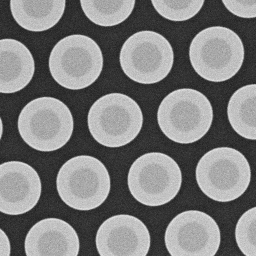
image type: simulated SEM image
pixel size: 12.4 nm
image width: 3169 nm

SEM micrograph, an array of small figures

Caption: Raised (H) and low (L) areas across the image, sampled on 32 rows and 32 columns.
LHHHHHHHLLHHHHHHHLLHHHHHHLLLHHHH
LHHHHHHHLLHHHHHHLLLLHHHHHLLLLHHH
LLHHHHHLLLLHHHHHLLLLLHHLLLLLLLLL
LLLHHHLLLLLLLLLLLLLLLLLLLLHHLLLL
LLLLLLLLLHHLLLLLHHHHLLLLHHHHHHLL
HHHLLLLHHHHHLLLLHHHHHLLLHHHHHHLL
HHHHLLHHHHHHHLLHHHHHHHLLHHHHHHLL
HHHHLLHHHHHHHLLHHHHHHHLLHHHHHHLL
HHHHLLHHHHHHHLLHHHHHHLLLHHHHHHLL
HHHHLLLHHHHHLLLLHHHHHLLLLHHHHLLL
HHHLLLLHHHHLLLLLLLLLLLLLLLLLLLLL
HHLLLLLLLLLLLLLLLLLLLLHHHLLLLHHH
LLLLHHHLLLLLHHHHHLLLHHHHHHLLLHHH
LLLHHHHHLLLHHHHHHLLLHHHHHHLLHHHH
LLHHHHHHHLLHHHHHHHLLHHHHHHHLLHHH
LLHHHHHHHLLHHHHHHHLLHHHHHHLLLHHH
LLHHHHHHHLLHHHHHHLLLHHHHHHLLLLHH
LLLHHHHHHLLLHHHHLLLLLLHHHLLLLLLL
LLLLHHHLLLLLLLLLLLLLLLLLLLLLHLLL
LLLLLLLLLLHLLLLLLLHHHLLLLHHHHHLL
HHHLLLLLHHHHHLLLLHHHHHLLLHHHHHHL
HHHHLLLHHHHHHLLLHHHHHHHLLHHHHHHL
HHHHHLLHHHHHHHLLHHHHHHHLLHHHHHHL
HHHHHLLHHHHHHHLLHHHHHHLLLHHHHHHL
HHHHHLLLHHHHHLLLLHHHHHLLLLHHHHLL
HHHHLLLLHHHHHLLLLLHHLLLLLLLLLLLL
HHHLLLLLLLLLLLLLLLLLLLLHHLLLLLLH
LLLLLHHHLLLLLHHHHLLLLLHHHHHLLLHH
LLLLHHHHHLLLHHHHHHLLLHHHHHHLLLHH
HLLHHHHHHHLLHHHHHHHLLHHHHHHLLHHH
HLLHHHHHHHLLHHHHHHHLLHHHHHHLLLHH
HLLHHHHHHHLLHHHHHHLLLHHHHHHLLLHH